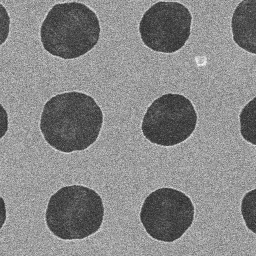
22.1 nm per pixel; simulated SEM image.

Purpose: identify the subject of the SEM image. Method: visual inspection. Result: holes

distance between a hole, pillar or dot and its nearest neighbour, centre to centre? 2.03 µm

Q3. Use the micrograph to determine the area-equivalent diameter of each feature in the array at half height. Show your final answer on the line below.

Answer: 1230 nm